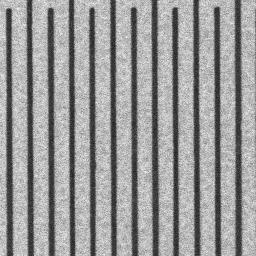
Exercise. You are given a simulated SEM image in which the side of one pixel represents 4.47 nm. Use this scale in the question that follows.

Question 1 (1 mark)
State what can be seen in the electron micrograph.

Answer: parallel lines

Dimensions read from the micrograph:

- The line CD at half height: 0.0682 um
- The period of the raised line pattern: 93 nm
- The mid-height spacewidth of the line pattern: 25.7 nm